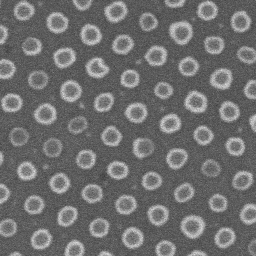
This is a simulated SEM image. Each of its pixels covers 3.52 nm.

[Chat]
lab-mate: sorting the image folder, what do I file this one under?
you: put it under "a regular array of raised bodies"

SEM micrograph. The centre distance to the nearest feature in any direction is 0.119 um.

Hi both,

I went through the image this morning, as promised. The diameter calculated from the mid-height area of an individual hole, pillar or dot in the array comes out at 70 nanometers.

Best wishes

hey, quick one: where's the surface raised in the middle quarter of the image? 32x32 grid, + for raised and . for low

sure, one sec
+....++++++..................+++
......+++++.....+............+++
......+++++....++++..........+++
..............+++++.............
+++...........+++++.............
++++...........+++.....+++......
++++...................++++.....
++++......++...........++++....+
++++....++++...................+
.+......++++..................++
........++++....++++..........++
........+++....++++++..........+
...............++++++...........
...++...........++++.....++++...
.+++++...........+++....+++++...
.+++++..................+++++...
..+++.....+++...........++++....
.........+++++..................
.........+++++..................
..........++++...+++++..........
............+....+++++..........
.................+++++.....+++..
....++++..........+++.....+++++.
...+++++..................+++++.
...+++++....++............++++..
....+++....+++++..........++++..
...........+++++................
...........+++++....+++.........
+...........+++.....++++........
+...................++++........
+.....+++...........++++.....+++
+....++++...................++++